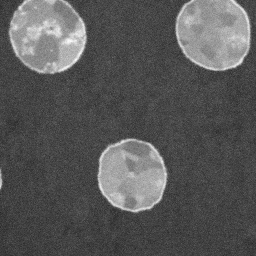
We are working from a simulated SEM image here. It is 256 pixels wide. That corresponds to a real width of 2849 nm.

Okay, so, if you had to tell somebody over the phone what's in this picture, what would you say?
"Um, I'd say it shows raised bodies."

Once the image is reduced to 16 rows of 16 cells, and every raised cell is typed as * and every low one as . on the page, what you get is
............***.
...........*****
...........*****
............***.
................
................
................
................
................
.......***......
......****......
......****......
.......***......
................
................
................